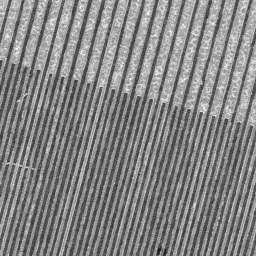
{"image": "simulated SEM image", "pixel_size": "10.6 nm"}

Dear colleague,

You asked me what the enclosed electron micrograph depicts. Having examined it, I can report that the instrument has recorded parallel lines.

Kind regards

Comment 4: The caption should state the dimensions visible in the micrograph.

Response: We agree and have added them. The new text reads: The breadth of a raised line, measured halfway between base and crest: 28.1 nm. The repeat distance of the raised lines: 68.3 nanometres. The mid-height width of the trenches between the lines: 40.8 nanometres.